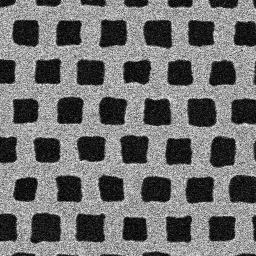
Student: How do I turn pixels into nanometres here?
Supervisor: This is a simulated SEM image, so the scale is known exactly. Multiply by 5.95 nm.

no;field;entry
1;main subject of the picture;a regular array of holes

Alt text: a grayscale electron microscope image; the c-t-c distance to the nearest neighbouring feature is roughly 256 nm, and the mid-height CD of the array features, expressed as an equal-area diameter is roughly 0.171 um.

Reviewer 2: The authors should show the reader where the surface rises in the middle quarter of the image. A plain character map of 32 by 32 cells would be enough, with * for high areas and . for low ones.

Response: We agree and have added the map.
***.......*****.......****......
***.......*****.......****......
***.......*****......*****......
***.......*****......*****......
***.......*****......*****......
*******..*********************.*
********************************
********************************
....******....******************
.....****.......****......*****.
.....****.......****.......****.
.....****......*****.......****.
.....****......*****.......****.
.....****......*****.......****.
....*****......*****.......****.
***********************.********
********************************
********************************
****......****.......*****..****
***.......****.......*****......
***.......****.......*****......
***.......****.......****.......
****......****.......****.......
****......****.......****.......
*******.*******......*****......
********************************
********************************
********************************
....*****.....******......*****.
....*****......****........****.
....*****......****........****.
....*****......****........***..